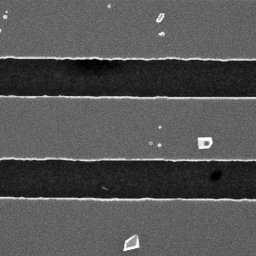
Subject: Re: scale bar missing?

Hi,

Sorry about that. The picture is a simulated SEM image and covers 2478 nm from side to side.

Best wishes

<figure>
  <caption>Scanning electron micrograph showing lines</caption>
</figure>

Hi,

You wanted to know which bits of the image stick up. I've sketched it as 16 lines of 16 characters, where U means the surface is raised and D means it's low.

UUUUUUUUUUUUUUUU
UUUUUUUUUUUUUUUU
UUUUUUUUUUUUUUUU
UUUUUUUUUUUUUUUU
DDDDDDDDDDDDDDDD
DDDDDDDDDDDDDDDD
UUUUUUUUUUUUUUUU
UUUUUUUUUUUUUUUU
UUUUUUUUUUUUUUUU
UUUUUUUUUUUUUUUU
DDDDDDDDDDDDDDDD
DDDDDDDDDDDDDDDD
UUUUUUUUUUUUUUUU
UUUUUUUUUUUUUUUU
UUUUUUUUUUUUUUUU
UUUUUUUUUUUUUUUU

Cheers